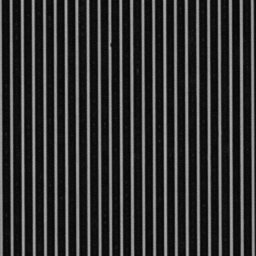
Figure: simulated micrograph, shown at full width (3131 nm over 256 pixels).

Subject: parallel lines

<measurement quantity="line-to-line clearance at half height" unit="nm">96.3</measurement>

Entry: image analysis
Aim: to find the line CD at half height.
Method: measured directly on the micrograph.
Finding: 35.2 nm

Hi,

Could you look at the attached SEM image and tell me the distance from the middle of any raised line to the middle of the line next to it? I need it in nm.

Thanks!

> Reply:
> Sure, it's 134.